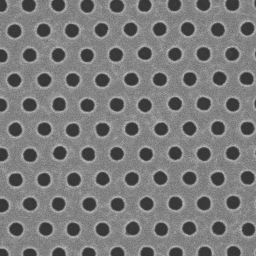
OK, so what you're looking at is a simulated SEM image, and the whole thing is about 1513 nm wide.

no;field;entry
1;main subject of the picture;a regular array of holes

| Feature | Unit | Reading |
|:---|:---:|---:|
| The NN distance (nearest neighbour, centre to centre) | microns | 0.166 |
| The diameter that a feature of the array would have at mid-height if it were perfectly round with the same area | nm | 82.5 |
